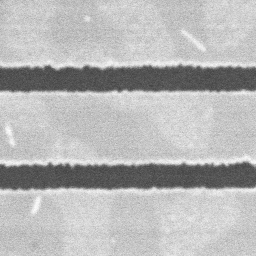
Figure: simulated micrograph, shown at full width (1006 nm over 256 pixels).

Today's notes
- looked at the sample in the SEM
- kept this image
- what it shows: lines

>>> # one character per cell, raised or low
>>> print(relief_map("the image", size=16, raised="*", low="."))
****************
****************
****************
****************
................
................
****************
****************
****************
****************
................
................
****************
****************
****************
****************